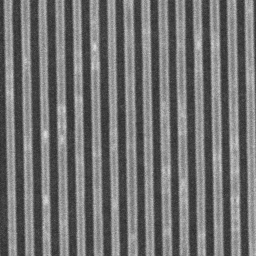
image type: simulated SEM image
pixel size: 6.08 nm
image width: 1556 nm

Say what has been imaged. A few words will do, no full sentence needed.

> parallel lines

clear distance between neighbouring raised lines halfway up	9.51	px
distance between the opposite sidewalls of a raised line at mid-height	46.4	nanometers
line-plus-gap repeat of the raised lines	105	nanometres